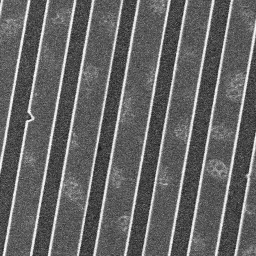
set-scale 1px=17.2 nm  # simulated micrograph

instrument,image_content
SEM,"parallel lines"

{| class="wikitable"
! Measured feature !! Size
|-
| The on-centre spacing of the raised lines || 779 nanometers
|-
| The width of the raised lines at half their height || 0.486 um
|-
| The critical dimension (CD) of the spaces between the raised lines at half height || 17.2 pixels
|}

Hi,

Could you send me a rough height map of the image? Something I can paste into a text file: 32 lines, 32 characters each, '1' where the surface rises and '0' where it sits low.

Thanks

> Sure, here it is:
11110011100011100111100111100111
11100011100111100111100111000111
11100011100111100111100111001111
11100111100111100111100111001111
11100111100111001111000111001111
11100111000111001111001111001111
11000111000111001111001111001110
11000111001111001111001110001110
11000111001111001111001110011110
11001111001111001111001110011110
11001111001110001110001110011110
11001110001110011110011110011110
10001110001110011110011100011100
10001110011110011110011100011100
10001110011110011110011100111100
10011110011110011100011100111100
10011110011100011100111100111100
10011100011100111100111100111100
00011100111100111100111100111000
00011100111100111100111000111000
00111100111100111100111001111001
00111100111100111000111001111001
00111000111001111001111001111001
00111000111001111001111001110001
00111001111001111001110001110001
00111001111001111001110001110011
01111001111001111001110011110011
01111001111001110001110011110011
01110001110011110011110011110011
01110001110011110011110011100011
01110011110011110011100011100011
01110011110011110011100011100111